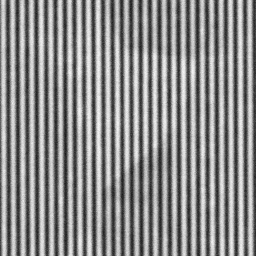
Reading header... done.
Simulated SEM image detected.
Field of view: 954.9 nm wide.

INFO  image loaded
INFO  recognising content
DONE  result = parallel lines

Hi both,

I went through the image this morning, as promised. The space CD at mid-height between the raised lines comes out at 18.2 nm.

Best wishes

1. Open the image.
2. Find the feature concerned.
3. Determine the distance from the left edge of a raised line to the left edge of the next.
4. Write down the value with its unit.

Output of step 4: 35.3 nm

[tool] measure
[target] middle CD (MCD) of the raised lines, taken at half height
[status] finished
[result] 17.7 nm